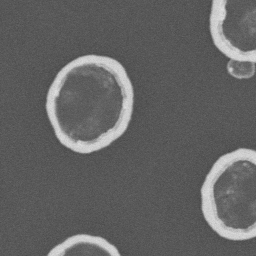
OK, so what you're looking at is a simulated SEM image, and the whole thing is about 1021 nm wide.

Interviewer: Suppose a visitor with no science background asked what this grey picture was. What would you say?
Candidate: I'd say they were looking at raised bodies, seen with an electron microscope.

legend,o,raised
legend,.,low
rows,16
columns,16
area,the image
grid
.............ooo
.............ooo
..............oo
...............o
....oooo........
...ooooo........
...ooooo........
...ooooo........
....ooo.........
................
..............oo
.............ooo
.............ooo
.............ooo
..............oo
....ooo.........